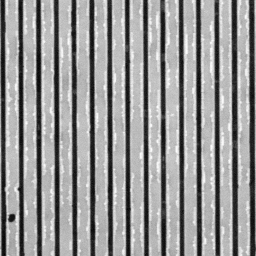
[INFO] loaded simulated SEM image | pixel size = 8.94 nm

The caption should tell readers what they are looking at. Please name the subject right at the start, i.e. parallel lines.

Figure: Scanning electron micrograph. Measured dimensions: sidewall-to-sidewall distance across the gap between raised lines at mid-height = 0.0536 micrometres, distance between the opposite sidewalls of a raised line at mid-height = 0.106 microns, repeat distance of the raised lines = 0.159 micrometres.